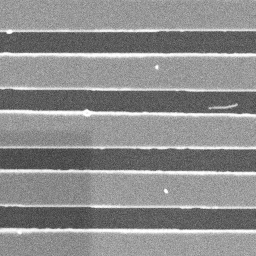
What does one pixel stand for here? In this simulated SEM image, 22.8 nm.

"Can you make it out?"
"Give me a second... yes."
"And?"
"lines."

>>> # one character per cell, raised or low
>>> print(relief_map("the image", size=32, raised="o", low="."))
oooooooooooooooooooooooooooooooo
oooooooooooooooooooooooooooooooo
oooooooooooooooooooooooooooooooo
oooooooooooooooooooooooooooooooo
................................
................................
................................
oooooooooooooooooooooooooooooooo
oooooooooooooooooooooooooooooooo
oooooooooooooooooooooooooooooooo
oooooooooooooooooooooooooooooooo
................................
................................
................................
oooooooooooooooooooooooooooooooo
oooooooooooooooooooooooooooooooo
oooooooooooooooooooooooooooooooo
oooooooooooooooooooooooooooooooo
...........oo...ooooo.oooooooooo
................................
................................
ooooooooooooooooooooooooo.......
oooooooooooooooooooooooooooooooo
oooooooooooooooooooooooooooooooo
oooooooooooooooooooooooooooooooo
oooooooooooooooooooooooooooooooo
................................
................................
................................
oooooooooooooooooooooooooooooooo
oooooooooooooooooooooooooooooooo
oooooooooooooooooooooooooooooooo